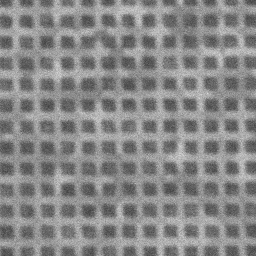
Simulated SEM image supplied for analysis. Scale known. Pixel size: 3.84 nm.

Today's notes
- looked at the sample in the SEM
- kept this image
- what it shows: a regular array of holes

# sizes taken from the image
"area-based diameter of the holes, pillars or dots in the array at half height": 16.8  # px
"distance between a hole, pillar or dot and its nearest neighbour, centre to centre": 20.2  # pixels